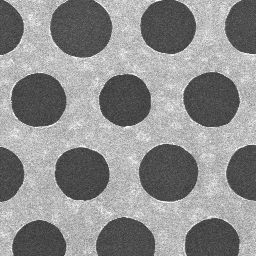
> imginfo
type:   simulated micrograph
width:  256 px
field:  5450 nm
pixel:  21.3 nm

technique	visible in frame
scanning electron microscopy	holes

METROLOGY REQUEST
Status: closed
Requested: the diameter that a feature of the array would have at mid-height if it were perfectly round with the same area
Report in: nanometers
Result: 1170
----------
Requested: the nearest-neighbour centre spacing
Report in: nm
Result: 1810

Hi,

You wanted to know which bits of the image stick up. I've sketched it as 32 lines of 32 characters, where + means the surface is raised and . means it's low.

.+++++++....+++++++....++++++...
..+++++......+++++......+++++...
...+++........++++......++++....
...+++........++++......++++....
...+++........++++......++++....
..+++++......+++++......+++++...
.+++++++.....+++++++..++++++++..
++++++++++++++++++++++++++++++++
++++++++++++++++++++++++++++++++
+++...++++++++...++++++++...++++
++......+++++.....++++++.....+++
++......+++++......++++.......++
+.......++++.......++++.......++
++......+++++......++++.......++
++......+++++.....++++++.....+++
+++....+++++++...++++++++...++++
++++++++++++++++++++++++++++++++
++++++++++++++++++++++++++++++++
.+++++++++.++++++++....+++++++..
..++++++.....+++++......+++++...
...++++......+++++.......++++...
...++++.......+++........+++....
...++++.......++++.......+++....
..+++++......+++++......+++++...
..++++++....+++++++....+++++++..
++++++++++++++++++++++++++++++++
++++++++++++++++++++++++++++++++
++++++++++++++...+++++++++..++++
+++....++++++.....++++++.....+++
++......++++.......++++.......++
++......++++.......++++.......++
++......++++.......++++.......++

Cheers